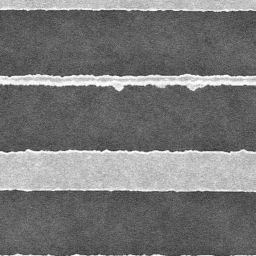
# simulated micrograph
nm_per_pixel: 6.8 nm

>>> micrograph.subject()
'lines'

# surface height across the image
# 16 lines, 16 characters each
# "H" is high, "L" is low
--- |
HHHHHHHHHHHHHHHH
LLLLLLLLLLLLLLLL
LLLLLLLLLLLLLLLL
LLLLLLLLLLLLLLLL
LLLLLLLLLLLLLLLL
LLLLLLLLLLLLLLLL
LLLLLLLLLLLLLLLL
LLLLLLLLLLLLLLLL
LLLLLLLLLLLLLLLL
LHHHHHHHHHHHHLLH
HHHHHHHHHHHHHHHH
HHHHHHHHHHHHHHHH
LLLLLLLLLLLLLLLL
LLLLLLLLLLLLLLLL
LLLLLLLLLLLLLLLL
LLLLLLLLLLLLLLLL